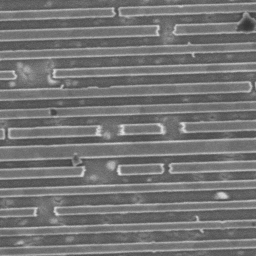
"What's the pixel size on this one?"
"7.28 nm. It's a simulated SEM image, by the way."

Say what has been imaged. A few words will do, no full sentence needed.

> parallel lines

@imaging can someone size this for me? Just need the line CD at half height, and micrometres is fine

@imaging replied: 0.06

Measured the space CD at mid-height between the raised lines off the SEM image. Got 79.1 nanometres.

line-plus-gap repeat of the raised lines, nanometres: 143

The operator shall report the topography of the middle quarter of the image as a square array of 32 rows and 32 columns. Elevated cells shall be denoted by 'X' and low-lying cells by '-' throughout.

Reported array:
-------------------------XXXXXXX
XXXXXXXXXXXXXXXXXXXXXXXXXXXXXXXX
XXXXXXXXXXXXXXXXXXXX------------
--------------------------------
--------------------------------
-------------------XXXXXXXXXXXXX
XXXXXXXXXXXXXXXXXXXXXXXXXXXXXXXX
XXXXXXXXXXXXXXXXXXXXXXXXXXX-----
--------------------------------
--------------------------------
--------------XXXXX-XXXXXXXXXXXX
XXXXXXXXXXXXXXXXXXXXXXXXXXXXXXXX
XXXXXXXXXXXXXXXXXXXXX-----------
--------------------------------
--------------------------------
-------XX------XXXXXXXXX------XX
XXXXXXXXX------XXXXXXXXXX-----XX
XXXXXXXX------------------------
--------------------------------
-----------------------XXXXXXXXX
XXXXXXXXXXXXXXXXXXXXXXXXXXXXXXXX
XXXXXXXXXXXXXXXXXXXXXXXXXXXXXXXX
XXXXXXXXXXXXXXXXXXXXXXXXXXXXX---
--XX----------------------------
--XX----------------------------
--X-----------XXXXXXXXXXX-XXXXXX
XXXXX--------XXXXXXXXXXXX--XXXXX
XXXXX---------XX----------------
--------------------------------
--------------------------------
--------XXXXXXXXXXXXXXXXXXXXXXXX
XXXXXXXXXXXXXXXXXXXXXXXXXXXXXXXX